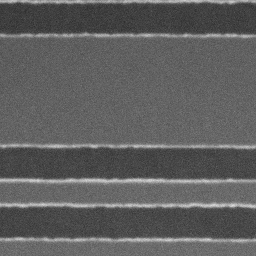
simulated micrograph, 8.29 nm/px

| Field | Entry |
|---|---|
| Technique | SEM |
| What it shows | lines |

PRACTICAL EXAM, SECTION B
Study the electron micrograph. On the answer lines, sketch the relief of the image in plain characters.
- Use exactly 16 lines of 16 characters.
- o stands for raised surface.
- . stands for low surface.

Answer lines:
................
................
oooooooooooooooo
oooooooooooooooo
oooooooooooooooo
oooooooooooooooo
oooooooooooooooo
oooooooooooooooo
oooooooooooooooo
................
................
oooooooooooooooo
oooooooooooooooo
................
................
oooooooooooooooo